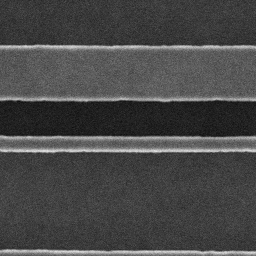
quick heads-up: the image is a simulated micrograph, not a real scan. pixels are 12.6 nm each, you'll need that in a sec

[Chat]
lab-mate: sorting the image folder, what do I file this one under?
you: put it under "lines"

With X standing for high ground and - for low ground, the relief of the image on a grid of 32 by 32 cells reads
--------------------------------
--------------------------------
--------------------------------
--------------------------------
--------------------------------
--------------------------------
XXXXXXXXXXXXXXXXXXXXXXXXXXXXXXXX
XXXXXXXXXXXXXXXXXXXXXXXXXXXXXXXX
XXXXXXXXXXXXXXXXXXXXXXXXXXXXXXXX
XXXXXXXXXXXXXXXXXXXXXXXXXXXXXXXX
XXXXXXXXXXXXXXXXXXXXXXXXXXXXXXXX
XXXXXXXXXXXXXXXXXXXXXXXXXXXXXXXX
---XX----XXX--X----XXXX--------X
--------------------------------
--------------------------------
--------------------------------
--------------------------------
XXXXXXXXXXXXXXXXXXXXXXXXXXXXXXXX
XXXXXXXXXXXXXXXXXXXXXXXXXXXXXXXX
--------------------------------
--------------------------------
--------------------------------
--------------------------------
--------------------------------
--------------------------------
--------------------------------
--------------------------------
--------------------------------
--------------------------------
--------------------------------
--------------------------------
XXXXXXXX-X----------------------